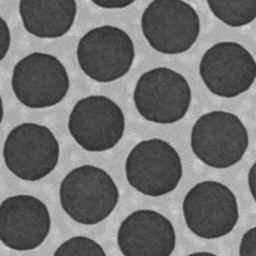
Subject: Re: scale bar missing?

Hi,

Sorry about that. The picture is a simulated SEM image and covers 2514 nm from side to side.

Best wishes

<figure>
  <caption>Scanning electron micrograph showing a regular array of holes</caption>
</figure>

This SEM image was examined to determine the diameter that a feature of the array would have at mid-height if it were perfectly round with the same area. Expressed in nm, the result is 560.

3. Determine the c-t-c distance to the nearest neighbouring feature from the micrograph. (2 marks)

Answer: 695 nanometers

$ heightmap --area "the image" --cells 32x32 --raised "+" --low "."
++........++....+++.....++......
++........++++++++......+++.....
+++......+++++++++.......+++....
.++......+++...+++.......+++++++
.+++....++......++.......+++++++
.+++++++++.......++.....+++...++
.+++++++++.......+++...+++.....+
+++....+++.......++++++++.......
++......++......++++.++++.......
++......+++....+++.....++.......
+........++++++++.......++.....+
++......+++++++++.......++....++
++......++....+++.......++++++++
++++.++++......++.......++++++++
+++++++++......+++.....++.....++
+++..++++.......++++++++......++
+.....+++......+++++++++.......+
+......++......++++.++++.......+
.......+++....+++.....++.......+
.......+++++++++......+++.....++
+......+++++++++.......+++...+++
+.....+++....+++.......++++++++.
+++..+++......++......+++++++++.
+++++++........++.....++.....++.
++..+++........++++.+++......+++
......++.......++++++++.......++
......++......+++...+++.......++
......+++....+++.....++.......++
......+++++++++.......++.....+++
......+++++++++.......+++...++..
+....+++....+++.......++++++++..
+++++++......++.......+++.++++..